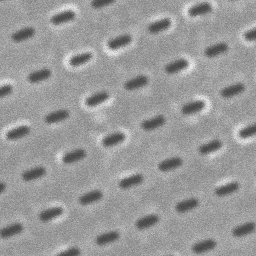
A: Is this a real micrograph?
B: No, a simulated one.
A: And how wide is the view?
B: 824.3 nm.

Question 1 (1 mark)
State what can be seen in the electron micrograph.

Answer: a regular array of holes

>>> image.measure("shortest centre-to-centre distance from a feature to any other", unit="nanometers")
138